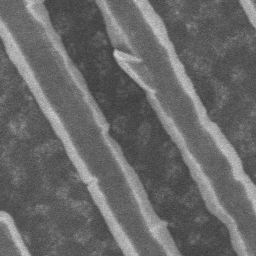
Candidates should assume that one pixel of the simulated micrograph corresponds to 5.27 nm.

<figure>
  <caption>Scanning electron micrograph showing one or a few lines or trenches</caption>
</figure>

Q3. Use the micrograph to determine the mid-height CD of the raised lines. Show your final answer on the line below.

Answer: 210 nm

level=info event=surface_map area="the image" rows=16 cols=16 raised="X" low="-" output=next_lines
XX----XXX-------
XXX----XXX------
XXX----XXX------
-XXX---XXXX-----
--XXX---XXX-----
--XXX----XXX----
---XXX----XX----
---XXX----XXX---
----XXX----XXX--
----XXX-----XX--
-----XXX----XXX-
------XX-----XXX
------XXX----XXX
-------XX-----XX
X------XXX-----X
X-------XXX----X